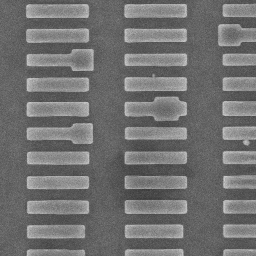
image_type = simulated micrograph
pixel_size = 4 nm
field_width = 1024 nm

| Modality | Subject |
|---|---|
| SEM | wiring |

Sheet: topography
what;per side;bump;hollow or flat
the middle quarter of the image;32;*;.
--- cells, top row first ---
.******.........................
..*****.........................
................................
******..........**************..
******.........****************.
******.........****************.
******..........**************..
................................
.......................*****....
......................********..
******.........****************.
******.........****************.
******.........****************.
.......................******...
................................
..*****.........................
*******........****************.
*******........****************.
*******........****************.
..*****.........................
................................
................................
******.........****************.
******.........****************.
******.........***************..
................................
................................
................................
******.........****************.
******.........****************.
******.........****************.
................................